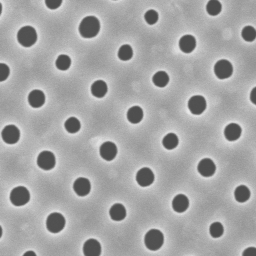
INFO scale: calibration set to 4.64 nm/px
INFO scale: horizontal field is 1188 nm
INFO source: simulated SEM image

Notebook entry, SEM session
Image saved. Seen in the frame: a regular array of holes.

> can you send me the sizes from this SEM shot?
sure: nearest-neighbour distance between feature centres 205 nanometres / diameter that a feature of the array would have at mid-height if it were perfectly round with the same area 81.9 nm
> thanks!